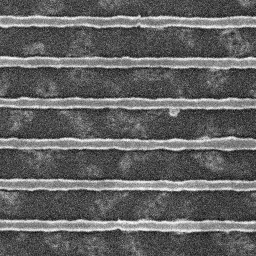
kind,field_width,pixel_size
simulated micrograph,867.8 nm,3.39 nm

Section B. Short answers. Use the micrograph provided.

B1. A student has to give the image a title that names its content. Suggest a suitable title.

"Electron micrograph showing parallel lines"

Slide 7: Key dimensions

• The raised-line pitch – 138 nanometers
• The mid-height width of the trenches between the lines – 0.108 um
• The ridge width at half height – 31.4 nanometres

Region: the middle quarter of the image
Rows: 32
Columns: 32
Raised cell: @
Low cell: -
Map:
---@@@@@@@@@@@@@@@@@@@@@@@@@@@@@
--------------------------------
--------------------------------
--------------------------------
--------------------------------
--------------------------------
--------------------------------
--------------------------------
--------------------------------
@@@@@@@@@@@@@@@@@@@@@@@@@@@@@@@@
@@@@@@@@@@@@@@@@@@@@@@@@@@@@@@@@
--------------------------------
--------------------------------
--------------------------------
--------------------------------
--------------------------------
--------------------------------
--------------------------------
--------------------------------
@@@@@@@@@@@@@@@@@@@@@@@@@@@@@@@@
@@@@@@@@@@@@@@@@@@@@@@@@@@@@@@@@
--------------------------------
--------------------------------
--------------------------------
--------------------------------
--------------------------------
--------------------------------
--------------------------------
--------------------------------
@@@@@@@@@@@@@@@@@@@@@@@@@@@@--@@
@@@@@@@@@@@@@@@@@@@@@@@@@@@@@@@@
--------------------------@@@---